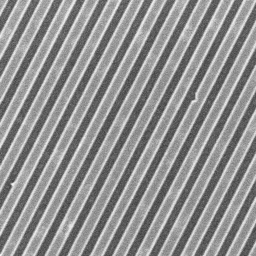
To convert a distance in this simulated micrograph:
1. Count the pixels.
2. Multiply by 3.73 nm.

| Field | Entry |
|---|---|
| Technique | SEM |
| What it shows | parallel lines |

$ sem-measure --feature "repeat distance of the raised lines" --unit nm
75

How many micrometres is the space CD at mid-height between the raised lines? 0.0336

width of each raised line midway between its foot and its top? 39.8 nanometers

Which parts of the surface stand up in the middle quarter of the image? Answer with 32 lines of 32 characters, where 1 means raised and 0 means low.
00011100111000111000111001110001
00111000111000111001110001110011
00111001110001110001110011100011
01110001110001100011100011100111
01110011100011100011000111000111
11100011100011000111000111001110
11100111000111000110001110001110
11000111000110001110001110011100
11001110001110001110011100011100
10001110001100011100011100111000
10011100011100011100111000111000
00011100111000111000111001110001
00111000111001110001110001110001
00111001110001110001110011100011
01110001110011100011100011100011
01110011100011100011100111000111
11100011100111000111000111001110
11100111000111000111001110001110
11000111001110001110001110011100
11001110001110001110011100011100
10001110011100011100011100111000
00011100011100011100111000111001
00011100111000111000111001110001
00111000111000110001110001110011
00111001110001110001110011100011
01110001110001100011100011100111
01110011100011100011100111000111
11100011100011000111000111001110
11100111000111000111001110001110
11000111000110001110001110011100
11001110001110001110011100011100
10001110001100011100011100111000